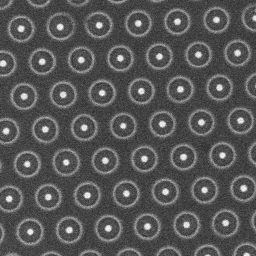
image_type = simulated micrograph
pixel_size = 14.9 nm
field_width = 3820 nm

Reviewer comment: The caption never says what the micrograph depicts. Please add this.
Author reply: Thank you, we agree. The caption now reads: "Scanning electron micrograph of an array of small figures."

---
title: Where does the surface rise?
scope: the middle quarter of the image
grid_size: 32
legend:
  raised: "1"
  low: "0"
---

11000001111100001111110000111111
11100011111111111111111111111111
11111111111111111111111111111111
11111111111111111111111111110111
11111111101111111100011111100001
00111110000011111000001111000000
00011110000011110001001111001100
00011110010001111000001111000000
00011110000011111000001111100001
00111111000111111100111111111111
11111111111111111111111111111111
11111111111111111111111111111111
11111111111111111111111000111111
11100001111110000111110000011111
11100000111100000111110010011110
11000000111100100011110010011111
11000000111100000111110000011111
11100000111110000111111000111111
11110011111111111111111111111111
11111111111111111111111111111111
11111111111111111111111111111001
11111111100111111100001111110000
00011111000001111100000111100000
00011110000001111000100111100100
10001110001001111000000111100000
00011111000001111100001111110000
00011111100011111110011111111111
01111111111111111111111111111111
11111111111111111111111111111111
11111111111111101111111100011111
11110000111110000011111000001111
11100000011110000011110001001111